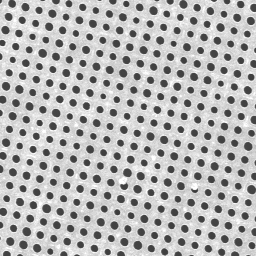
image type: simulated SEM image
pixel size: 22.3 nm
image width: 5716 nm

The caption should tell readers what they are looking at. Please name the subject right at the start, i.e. a regular array of holes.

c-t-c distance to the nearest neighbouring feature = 301 nm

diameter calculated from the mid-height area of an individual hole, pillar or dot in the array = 172 nm